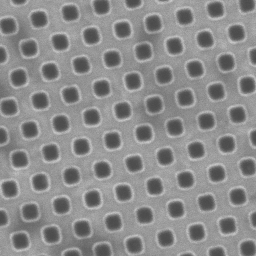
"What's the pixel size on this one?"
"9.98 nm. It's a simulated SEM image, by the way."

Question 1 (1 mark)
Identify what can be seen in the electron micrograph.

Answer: a regular array of raised bodies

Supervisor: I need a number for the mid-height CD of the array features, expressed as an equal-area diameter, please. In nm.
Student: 207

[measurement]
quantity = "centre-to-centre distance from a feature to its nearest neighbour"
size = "307 nm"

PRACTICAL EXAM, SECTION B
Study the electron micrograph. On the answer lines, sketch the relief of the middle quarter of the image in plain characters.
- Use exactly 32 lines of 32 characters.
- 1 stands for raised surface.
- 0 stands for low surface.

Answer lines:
00111110001111000000000011000011
00111110000000000000000111100001
00011100000000011110000111100001
00000000000000011110000111110001
00000001111000011111000111100000
01100001111100011111000000000000
11110001111100001110000000000111
11110001111100000000000000001111
11110000100000000000011110001111
11110000000000110000111110001111
00000000000011111000111110000111
00000111100011111000111110000000
00001111100001111000011000000000
10000111100001111000000000011000
10000111100000000000000001111100
11000111000000000011110001111100
10000000000000000111110001111100
00000000001111000011110000111100
00011100001111000011110000000000
00111100001111100011100000000000
00111110001111000000000000000001
00111110000110000000000111100001
00011100000000000010000111110001
00000000000000011111000111110001
00000000111000011111000111110000
00000001111100011111000011000000
11110001111100001111000000000010
11110000111100000000000000001111
11110000111000000000011100001111
11110000000000000000111110001111
01000000000001111000111110001111
00000011100011111000011110000000